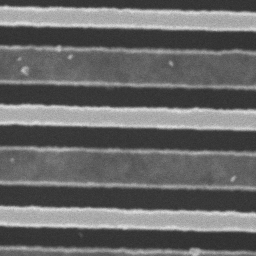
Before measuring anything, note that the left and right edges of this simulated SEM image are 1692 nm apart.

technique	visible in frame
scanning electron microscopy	lines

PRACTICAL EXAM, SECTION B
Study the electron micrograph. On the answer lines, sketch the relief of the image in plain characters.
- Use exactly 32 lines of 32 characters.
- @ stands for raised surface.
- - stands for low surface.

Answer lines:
--------------------------------
@@@@@@@@@@@@@@@@@@@@@@@@@@@@@---
@@@@@@@@@@@@@@@@@@@@@@@@@@@@@@@@
------------------@@@@@@@@@@@@@@
--------------------------------
--------------------------------
@@@@@@@@@@@@@@@@@@@@@@@@@@@@@@@@
@@@@@@@@@@@@@@@@@@@@@@@@@@@@@@@@
@@@@@@@@@@@@@@@@@@@@@@@@@@@@@@@@
@@@@@@@@@@@@@@@@@@@@@@@@@@@@@@@@
-------@@@@@@@@@@@@@@@@@@@@@@@@@
--------------------------------
--------------------------------
@@@@@@@@@@@@@@-@-@@-@---@-------
@@@@@@@@@@@@@@@@@@@@@@@@@@@@@@@@
---@@@@@@@@@@@@@@@@@@@@@@@@@@@@@
--------------------------------
--------------------------------
@@@@@---------------------------
@@@@@@@@@@@@@@@@@@@@@@@@@@@@@@@@
@@@@@@@@@@@@@@@@@@@@@@@@@@@@@@@@
@@@@@@@@@@@@@@@@@@@@@@@@@@@@@@@@
@@@@@@@@@@@@@@@@@@@@@@@@@@@@@@@@
-------------------------@@@@@@@
--------------------------------
--------------------------------
@@@@@@@@@@@@@@@@@@@@@@@@@@------
@@@@@@@@@@@@@@@@@@@@@@@@@@@@@@@@
-----------@-@@@@@@@@@@@@@@@@@@@
--------------------------------
--------------------------------
@@@@@@@@@@@@@@@@@@@@@@@@@@@@@@@@